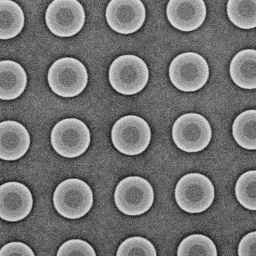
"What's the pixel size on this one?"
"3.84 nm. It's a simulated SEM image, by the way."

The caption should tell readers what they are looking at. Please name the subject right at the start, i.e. an array of small figures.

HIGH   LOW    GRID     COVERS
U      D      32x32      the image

UUDDDDUUUUDDDDUUUUDDDUUUUUDDUUUU
UUUDDDUUUUDDDUUUUUDDDUUUUUDDUUUU
UUUDDDUUUUUDDUUUUUDDDUUUUDDDDUUU
UUUDDDUUUUDDDDUUUDDDDDUUUDDDDDUD
UUDDDDDUUDDDDDDDDDDDDDDDDDDDDDDD
DDDDDDDDDDDDDDDDDDDDDDDDDDDDDDDD
DDDDDDDDDDDDDDDDDDDDDDDDDDDDDDUU
DDDDDDDUUUDDDDUUUUDDDDUUUUDDDUUU
UUUDDDUUUUUDDDUUUUDDDUUUUUDDDUUU
UUUDDDUUUUUDDDUUUUDDDUUUUUDDDUUU
UUUDDDUUUUUDDDUUUUDDDDUUUUDDDDUU
UUUDDDDUUUDDDDDUUDDDDDDDDDDDDDDD
DDDDDDDDDDDDDDDDDDDDDDDDDDDDDDDD
DDDDDDDDDDDDDDDDDDDDDDDDDDDDDDDD
DDDDDDDDDDDDDDDDUDDDDDDUUDDDDDUU
UUUDDDDUUUUDDDUUUUDDDDUUUUDDDUUU
UUUDDDUUUUUDDDUUUUUDDDUUUUDDDUUU
UUUUDDUUUUUDDDUUUUUDDDUUUUDDDUUU
UUUDDDDUUUUDDDDUUUDDDDUUUDDDDDDU
UUUDDDDDUUDDDDDDDDDDDDDDDDDDDDDD
DDDDDDDDDDDDDDDDDDDDDDDDDDDDDDDD
DDDDDDDDDDDDDDDDDDDDDDDDDDDDDDDU
DDDDDDDDUUDDDDDUUUDDDDUUUUDDDDUU
UUUDDDDUUUUDDDDUUUUDDDUUUUUDDUUU
UUUUDDDUUUUUDDUUUUUDDDUUUUUDDDUU
UUUUDDDUUUUDDDDUUUUDDDUUUUDDDDUU
UUUUDDDUUUUDDDDUUUDDDDDDUDDDDDDD
DUDDDDDDDDDDDDDDDDDDDDDDDDDDDDDD
DDDDDDDDDDDDDDDDDDDDDDDDDDDDDDDD
DDDDDDDDDDDDDDDDDDDDDDDDUUDDDDDU
DUUDDDDDUUUDDDDUUUUDDDDUUUUDDDUU
UUUUDDDUUUUUDDDUUUUDDDUUUUUDDDUU